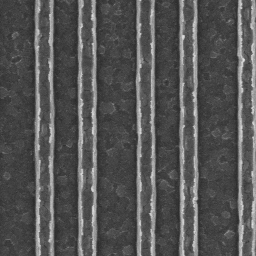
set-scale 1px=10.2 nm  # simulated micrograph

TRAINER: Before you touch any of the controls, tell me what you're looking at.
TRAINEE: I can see parallel lines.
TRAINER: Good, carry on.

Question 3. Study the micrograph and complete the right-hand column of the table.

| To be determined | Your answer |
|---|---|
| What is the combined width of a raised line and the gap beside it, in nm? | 516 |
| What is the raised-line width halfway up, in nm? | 154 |